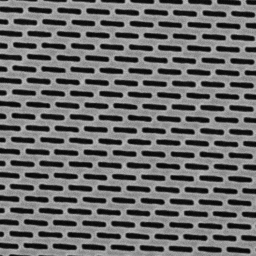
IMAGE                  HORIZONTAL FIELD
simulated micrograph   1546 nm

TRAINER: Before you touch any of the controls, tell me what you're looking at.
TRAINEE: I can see a regular array of holes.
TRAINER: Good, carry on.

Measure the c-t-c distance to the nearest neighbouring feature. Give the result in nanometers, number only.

110